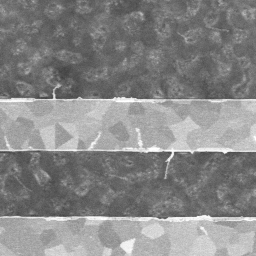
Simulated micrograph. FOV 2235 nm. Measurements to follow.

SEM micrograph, one or a few lines or trenches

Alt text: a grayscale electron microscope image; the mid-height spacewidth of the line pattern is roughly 579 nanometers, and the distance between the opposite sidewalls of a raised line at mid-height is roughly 52.3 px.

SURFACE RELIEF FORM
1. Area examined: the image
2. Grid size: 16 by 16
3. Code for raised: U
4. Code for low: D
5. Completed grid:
DDDDDDDDDDDDDDDD
DDDDDDDDDDDDDDDD
DDDDDDDDDDDDDDDD
DDDDDDDDDDDDDDDD
DDDDDDDDDDDDDDDD
DDDDDDDDDDDDDDDD
UUUUUUUUUUUUUUUU
UUUUUUUUUUUUUUUU
UUUUUUUUUUUUUUUU
DDDDDDDDDUDDDDUD
DDDDDDDDDDDDDDDD
DDDDDDDDDDDDDDDD
DDDDDDDDDDDDDDDD
DDDDDDDDDDDDDDDD
UUUUUUUUUUUUUUUU
UUUUUUUUUUUUUUUU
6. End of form